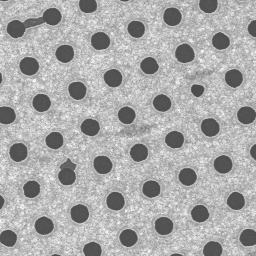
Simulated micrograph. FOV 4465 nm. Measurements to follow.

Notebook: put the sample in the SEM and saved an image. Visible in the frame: a regular array of holes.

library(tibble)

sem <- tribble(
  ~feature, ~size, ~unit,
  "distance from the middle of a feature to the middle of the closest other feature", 657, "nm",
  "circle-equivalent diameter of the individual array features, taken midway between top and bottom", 0.319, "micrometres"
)